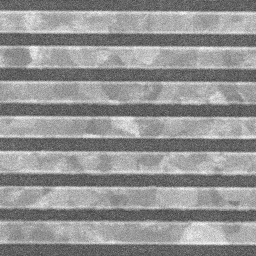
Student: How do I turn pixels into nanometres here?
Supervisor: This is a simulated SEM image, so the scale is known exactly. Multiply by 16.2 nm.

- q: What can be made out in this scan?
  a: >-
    parallel lines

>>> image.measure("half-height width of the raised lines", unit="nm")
329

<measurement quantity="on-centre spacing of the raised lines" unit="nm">567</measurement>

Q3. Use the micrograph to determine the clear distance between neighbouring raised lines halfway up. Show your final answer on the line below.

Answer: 238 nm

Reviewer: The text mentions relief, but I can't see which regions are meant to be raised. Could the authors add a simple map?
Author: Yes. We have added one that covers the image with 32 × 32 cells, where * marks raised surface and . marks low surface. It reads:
................................
******..........................
********************************
********************************
................................
................................
********************************
********************************
................................
................................
*****************************.**
********************************
********************************
................................
................................
********************************
********************************
................................
................................
********************************
********************************
...........*********************
................................
*****************...............
********************************
********************************
................................
................................
********************************
********************************
................................
................................